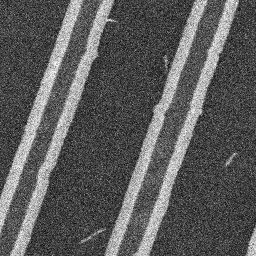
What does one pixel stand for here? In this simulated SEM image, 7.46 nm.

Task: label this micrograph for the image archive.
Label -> one or a few lines or trenches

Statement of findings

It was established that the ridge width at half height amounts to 219 nanometers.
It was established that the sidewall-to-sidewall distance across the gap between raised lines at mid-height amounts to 0.663 microns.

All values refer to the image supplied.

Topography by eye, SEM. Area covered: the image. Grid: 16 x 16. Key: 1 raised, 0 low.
0000011000001100
0000110000001100
0000110000001100
0000110000011000
0001100000011000
0001100000011000
0001000000110000
0011000000110000
0011000000110000
0110000001100000
0110000001100000
0110000001000000
1100000011000000
1100000011000000
1100000110000000
1000000110000000